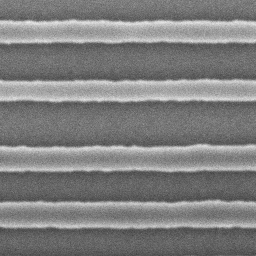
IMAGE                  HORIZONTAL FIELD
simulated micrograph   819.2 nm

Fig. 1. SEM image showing lines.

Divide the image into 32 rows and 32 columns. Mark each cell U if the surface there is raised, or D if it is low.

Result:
DDDDDDDDDDDDDDDDDDDDDDDDDDDDDDDD
DDDDDDDDDDDDDDDDDDDDDDDDDDDDDDDD
DDDDDDDDDDDDDDDDDDDDDDDDDDDDDDDD
UUUUUUUUUUUUUUUUUUUUUUUUUUUUUUUU
UUUUUUUUUUUUUUUUUUUUUUUUUUUUUUUU
DDDDDDDDDDDDDDDDDDDDDDDDDDDDDDDD
DDDDDDDDDDDDDDDDDDDDDDDDDDDDDDDD
DDDDDDDDDDDDDDDDDDDDDDDDDDDDDDDD
DDDDDDDDDDDDDDDDDDDDDDDDDDDDDDDD
DDDDDDDDDDDDDDDDDDDDDDDDDDDDDDDD
UUUUUUUUUUUUUUUUUUUUUUUUUUUUUUUU
UUUUUUUUUUUUUUUUUUUUUUUUUUUUUUUU
UUDDUUUUUUUUUUUUUUUDUDUUUUUUUUUU
DDDDDDDDDDDDDDDDDDDDDDDDDDDDDDDD
DDDDDDDDDDDDDDDDDDDDDDDDDDDDDDDD
DDDDDDDDDDDDDDDDDDDDDDDDDDDDDDDD
DDDDDDDDDDDDDDDDDDDDDDDDDDDDDDDD
DDDDDDDDDDDDDDDDDDDDDDDDDDDDDDDD
UUUUDDUUDDUUUUUUUUDUUUUUUUUUUUUU
UUUUUUUUUUUUUUUUUUUUUUUUUUUUUUUU
UUUUUUUUUUUUUUUUUUUUUUUUUUUUUUUU
DDDDDDDDDDDDDDDDDDDDDDDDDDDDDDDD
DDDDDDDDDDDDDDDDDDDDDDDDDDDDDDDD
DDDDDDDDDDDDDDDDDDDDDDDDDDDDDDDD
DDDDDDDDDDDDDDDDDDDDDDDDDDDDDDDD
UUUUUUUUUUUUUUUUUUUUUUUUUUUUUUUU
UUUUUUUUUUUUUUUUUUUUUUUUUUUUUUUU
UUUUUUUUUUUUUUUUUUUUUUUUUUUUUUUU
DDDDDDDDDDDDDDDDDDDDDDDDDDDDDDDD
DDDDDDDDDDDDDDDDDDDDDDDDDDDDDDDD
DDDDDDDDDDDDDDDDDDDDDDDDDDDDDDDD
DDDDDDDDDDDDDDDDDDDDDDDDDDDDDDDD